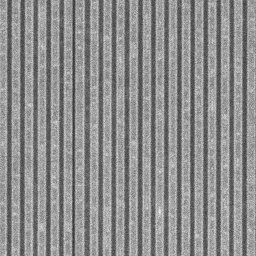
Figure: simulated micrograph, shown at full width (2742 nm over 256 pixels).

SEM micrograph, parallel lines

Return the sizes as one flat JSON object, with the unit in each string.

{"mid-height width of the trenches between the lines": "58.9 nm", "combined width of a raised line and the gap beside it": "140 nanometers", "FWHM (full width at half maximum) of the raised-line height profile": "79 nm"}